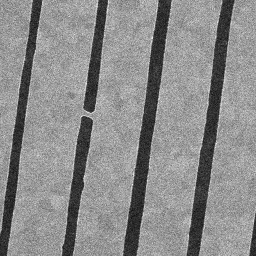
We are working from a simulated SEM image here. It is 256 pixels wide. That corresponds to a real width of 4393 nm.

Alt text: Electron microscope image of one or a few lines or trenches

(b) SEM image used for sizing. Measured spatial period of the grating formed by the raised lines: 1080 nm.